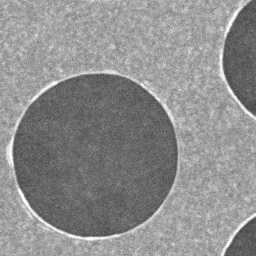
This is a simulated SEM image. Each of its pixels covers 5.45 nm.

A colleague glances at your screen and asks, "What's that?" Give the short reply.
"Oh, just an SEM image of holes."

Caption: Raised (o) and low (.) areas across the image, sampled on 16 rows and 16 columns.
ooooooooooooooo.
ooooooooooooooo.
oooooooooooooo..
oooooooooooooo..
oooooooooooooo..
ooo......ooooo..
oo........ooooo.
o..........ooooo
o..........ooooo
o..........ooooo
o..........ooooo
o..........ooooo
oo........oooooo
oo.......ooooooo
oooo....ooooooo.
oooooooooooooo..